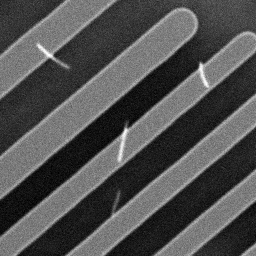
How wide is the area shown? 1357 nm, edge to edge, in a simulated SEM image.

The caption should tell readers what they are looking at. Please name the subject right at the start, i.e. groups of lines, slits or small figures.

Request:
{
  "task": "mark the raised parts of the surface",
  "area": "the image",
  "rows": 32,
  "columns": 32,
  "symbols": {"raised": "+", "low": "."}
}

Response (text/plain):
........++++++..................
.......++++++........+++........
.....+++++++........+++++.......
....++++++.........++++++.......
...++++++.........++++++......++
..++++++.........++++++......+++
.++++++........+++++++.....+++++
++++++........+++++++.....+++++.
++++.........++++++......+++++..
+++.........++++++......++++....
++.........++++++......++++.....
+.........++++++.....+++++......
........+++++++.....+++++......+
.......+++++++.....+++++......++
......++++++......++++.......+++
.....++++++......++++.......++++
....++++++.....+++++......+++++.
..+++++++.....+++++......+++++..
.+++++++.....+++++......+++++...
++++++......+++++......+++++....
+++++......++++.......++++......
++++......++++.......++++.......
+++......++++......+++++......++
++.....+++++......+++++......+++
......+++++......+++++......++++
.....+++++......+++++......++++.
....++++.......++++.......++++..
...++++......+++++......+++++...
.+++++......+++++......+++++....
+++++......+++++......+++++.....
++++......+++++......++++.......
++.......+++++......++++.......+